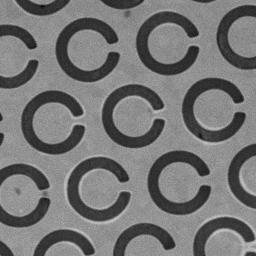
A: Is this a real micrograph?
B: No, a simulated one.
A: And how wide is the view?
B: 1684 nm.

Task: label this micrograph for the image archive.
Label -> an array of small figures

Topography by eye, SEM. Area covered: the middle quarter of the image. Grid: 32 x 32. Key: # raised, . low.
...######....#######............
.....##.....#########..........#
#..........############......###
##........######################
####....########################
###############.....############
############..........#########.
.##########............#######..
...########.....###.....######..
....######....#######....#####..
....######...#########...####...
#....####....#########..#####...
##...####...#################...
#########...###########.######..
#########...##########...#####..
##...#####...#########...#####..
##...#####....#######....######.
#....######....#####....########
#....######............#########
....#########..........#########
...###########.......###########
..##########################.###
#########################.......
######.....############.........
####.........##########.........
###...........########....######
##......##.....######....#######
#.....######....#####...########
#....########...#####...########
#...##########..#####...########
....#################...########
....#################...########